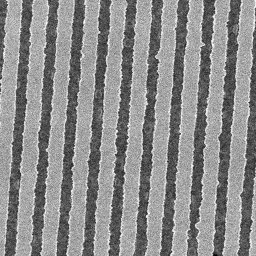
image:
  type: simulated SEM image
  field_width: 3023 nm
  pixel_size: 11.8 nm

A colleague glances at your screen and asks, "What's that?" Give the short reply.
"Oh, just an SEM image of parallel lines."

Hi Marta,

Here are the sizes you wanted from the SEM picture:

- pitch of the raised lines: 306 nanometers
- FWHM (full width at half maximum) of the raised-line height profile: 171 nanometers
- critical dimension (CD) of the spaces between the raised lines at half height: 11.2 pixels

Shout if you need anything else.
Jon